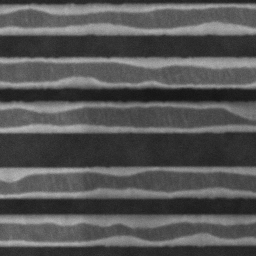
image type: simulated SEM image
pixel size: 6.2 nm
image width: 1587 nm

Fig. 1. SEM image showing lines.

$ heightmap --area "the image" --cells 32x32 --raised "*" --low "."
................................
********************************
********************************
********************************
................................
................................
................................
*****************....**.........
********************************
********************************
********************************
................................
................................
********************************
********************************
********************************
................................
................................
................................
................................
................................
*.******************************
********************************
********************************
************...*..*****.......**
................................
................................
********************************
********************************
********************************
**************...*****......**..
................................